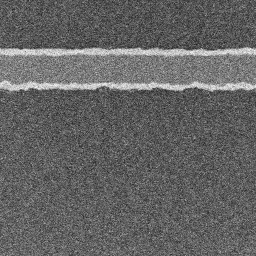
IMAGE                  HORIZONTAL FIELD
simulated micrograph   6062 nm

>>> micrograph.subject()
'one or a few lines or trenches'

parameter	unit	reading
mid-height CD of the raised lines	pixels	34.1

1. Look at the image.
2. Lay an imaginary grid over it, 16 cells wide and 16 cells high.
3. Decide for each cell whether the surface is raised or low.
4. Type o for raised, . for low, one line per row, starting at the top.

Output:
................
................
................
oooooooooooooooo
oooooooooooooooo
................
................
................
................
................
................
................
................
................
................
................